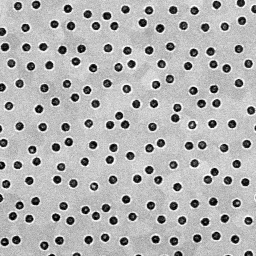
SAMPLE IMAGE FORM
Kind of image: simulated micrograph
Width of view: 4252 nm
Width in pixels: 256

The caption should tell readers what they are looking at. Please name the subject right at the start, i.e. a regular array of holes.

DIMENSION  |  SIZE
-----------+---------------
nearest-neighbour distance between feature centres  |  284 nanometers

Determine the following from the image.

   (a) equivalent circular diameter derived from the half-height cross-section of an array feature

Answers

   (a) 149 nm